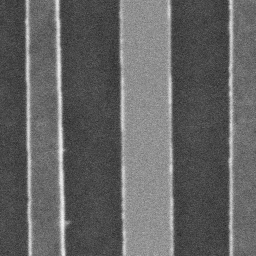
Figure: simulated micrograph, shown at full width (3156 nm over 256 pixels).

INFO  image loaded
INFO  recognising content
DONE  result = lines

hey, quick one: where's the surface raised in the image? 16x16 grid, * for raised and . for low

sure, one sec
..**....***...**
..**....***...**
..**....***...**
..**....***...**
..**....***...**
..**....***...**
..**....***...**
..**....***...**
..**....***...**
..**....***...**
..**....***...**
..**....***...**
..**....***...**
..**....***...**
..**....***...**
..**....***...**